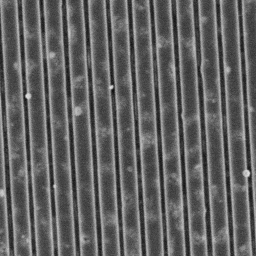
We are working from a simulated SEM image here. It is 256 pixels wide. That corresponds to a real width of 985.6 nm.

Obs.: parallel lines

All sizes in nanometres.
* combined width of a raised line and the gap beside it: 84.6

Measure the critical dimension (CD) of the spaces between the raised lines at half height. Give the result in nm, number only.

17.8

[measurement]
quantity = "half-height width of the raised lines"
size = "17.2 px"